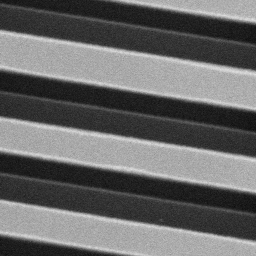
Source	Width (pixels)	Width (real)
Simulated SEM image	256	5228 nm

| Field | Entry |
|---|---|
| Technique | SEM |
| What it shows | lines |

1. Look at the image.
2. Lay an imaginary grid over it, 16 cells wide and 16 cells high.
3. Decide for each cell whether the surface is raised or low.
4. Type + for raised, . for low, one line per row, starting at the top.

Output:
..........++++++
................
++++............
++++++++++......
.+++++++++++++++
.......+++++++++
.............+++
+...............
++++++++........
++++++++++++++..
......++++++++++
.............+++
................
++++++..........
++++++++++++....
.....+++++++++++